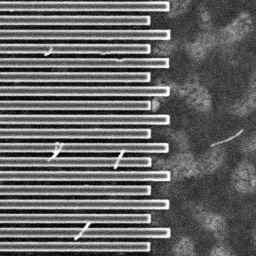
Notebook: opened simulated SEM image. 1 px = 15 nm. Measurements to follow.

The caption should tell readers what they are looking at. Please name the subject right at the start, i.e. parallel lines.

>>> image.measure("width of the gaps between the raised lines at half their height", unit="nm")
82.4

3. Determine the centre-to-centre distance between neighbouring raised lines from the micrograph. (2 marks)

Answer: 0.212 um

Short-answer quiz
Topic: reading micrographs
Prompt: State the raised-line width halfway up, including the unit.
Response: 124 nm